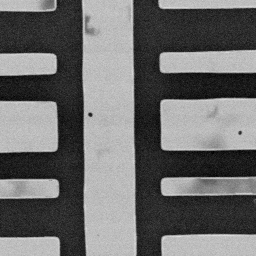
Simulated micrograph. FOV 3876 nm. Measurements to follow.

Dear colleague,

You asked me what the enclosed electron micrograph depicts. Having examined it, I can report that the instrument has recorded groups of lines, slits or small figures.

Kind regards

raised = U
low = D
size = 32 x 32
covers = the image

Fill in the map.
UUUUUUUDDDUUUUUUDDDDUUUUUUUUUUUU
DDDDDDDDDDUUUUUUDDDDDDDDDDDDDDDD
DDDDDDDDDDUUUUUUDDDDDDDDDDDDDDDD
DDDDDDDDDDUUUUUUUDDDDDDDDDDDDDDD
DDDDDDDDDDUUUUUUUDDDDDDDDDDDDDDD
DDDDDDDDDDUUUUUUUDDDDDDDDDDDDDDD
DDDDDDDDDDUUUUUUUDDDDDDDDDUUUUUU
UUUUUUUDDDUUUUUUUDDDUUUUUUUUUUUU
UUUUUUUDDDUUUUUUUDDDUUUUUUUUUUUU
DDDDDDDDDDUUUUUUUDDDDDDDDDDDDDDD
DDDDDDDDDDUUUUUUUDDDDDDDDDDDDDDD
DDDDDDDDDDDUUUUUUDDDDDDDDDDDDDDD
DDDDDDDDDDDUUUUUUDDDDDDDDDUUUUUU
UUUUUUUDDDDUUUUUUDDDUUUUUUUUUUUU
UUUUUUUDDDDUUUUUUDDDUUUUUUUUUUUU
UUUUUUUDDDDUUUUUUDDDUUUUUUUUUUUU
UUUUUUUDDDDUUUUUUDDDUUUUUUUUUUUU
UUUUUUUDDDDUUUUUUDDDUUUUUUUUUUUU
UUUUUUUDDDDUUUUUUDDDUUUUUUUUUUUU
DDDDDDDDDDDUUUUUUDDDDDDDDDDDDDDD
DDDDDDDDDDDUUUUUUDDDDDDDDDDDDDDD
DDDDDDDDDDDUUUUUUDDDDDDDDDDDDDDD
DDUUUUUDDDDUUUUUUDDDUUUUUUUUUUUU
UUUUUUUDDDDUUUUUUDDDUUUUUUUUUUUU
UUUUUUUDDDDUUUUUUDDDDDDDDDDDDDDD
DDDDDDDDDDDUUUUUUDDDDDDDDDDDDDDD
DDDDDDDDDDDUUUUUUDDDDDDDDDDDDDDD
DDDDDDDDDDDUUUUUUDDDDDDDDDDDDDDD
DDDDDDDDDDDUUUUUUDDDDDDDDDDDDDDD
DDDDDDDDDDDUUUUUUDDDDDUUUUUUUUUU
UUUUUUUDDDDUUUUUUDDDUUUUUUUUUUUU
UUUUUUUDDDDUUUUUUDDDUUUUUUUUUUUU